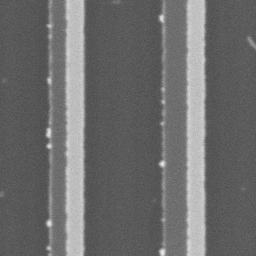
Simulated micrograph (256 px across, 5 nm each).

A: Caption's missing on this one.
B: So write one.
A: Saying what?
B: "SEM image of lines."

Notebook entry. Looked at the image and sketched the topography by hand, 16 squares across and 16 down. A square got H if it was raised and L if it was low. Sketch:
LLLHHLLLLLHHHLLL
LLLHHLLLLLHHHLLL
LLLHHLLLLLHHHLLL
LLLHHLLLLLHHHLLL
LLLHHLLLLLHHHLLL
LLLHHLLLLLHHHLLL
LLLHHLLLLLHHHLLL
LLLHHLLLLLHHHLLL
LLLHHLLLLLHHHLLL
LLLHHLLLLLHHHLLL
LLLHHLLLLLHHHLLL
LLLHHLLLLLHHHLLL
LLLHHLLLLLHHHLLL
LLLHHLLLLLHHHLLL
LLLHHLLLLLHHHLLL
LLLHHLLLLLHHHLLL